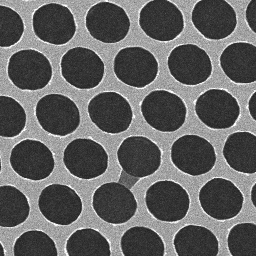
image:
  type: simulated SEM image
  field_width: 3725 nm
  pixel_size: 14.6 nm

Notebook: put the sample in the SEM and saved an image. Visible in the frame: a regular array of holes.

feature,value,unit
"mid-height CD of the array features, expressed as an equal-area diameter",617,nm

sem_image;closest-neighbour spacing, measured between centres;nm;758